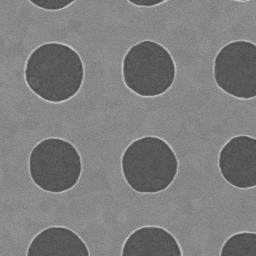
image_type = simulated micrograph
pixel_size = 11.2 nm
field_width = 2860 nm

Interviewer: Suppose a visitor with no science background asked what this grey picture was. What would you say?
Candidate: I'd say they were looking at holes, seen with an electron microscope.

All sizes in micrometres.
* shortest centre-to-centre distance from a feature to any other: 1.05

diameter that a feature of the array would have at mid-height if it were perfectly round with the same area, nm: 611